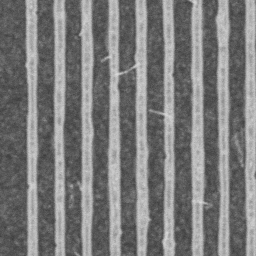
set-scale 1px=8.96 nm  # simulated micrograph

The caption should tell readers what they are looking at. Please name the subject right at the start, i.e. parallel lines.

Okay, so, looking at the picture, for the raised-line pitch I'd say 245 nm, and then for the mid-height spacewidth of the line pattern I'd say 182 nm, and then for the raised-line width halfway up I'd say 0.0661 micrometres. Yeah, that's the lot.